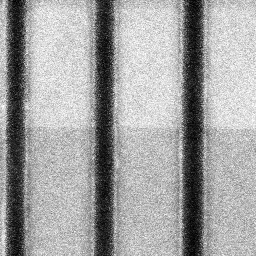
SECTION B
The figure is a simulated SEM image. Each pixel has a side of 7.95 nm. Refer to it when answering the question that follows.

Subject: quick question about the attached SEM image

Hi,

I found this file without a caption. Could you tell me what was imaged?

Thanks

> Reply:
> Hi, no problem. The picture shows one or a few lines or trenches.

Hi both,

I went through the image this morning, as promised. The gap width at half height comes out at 0.514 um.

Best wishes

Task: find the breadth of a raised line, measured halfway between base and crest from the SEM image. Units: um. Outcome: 0.19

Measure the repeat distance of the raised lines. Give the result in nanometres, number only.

704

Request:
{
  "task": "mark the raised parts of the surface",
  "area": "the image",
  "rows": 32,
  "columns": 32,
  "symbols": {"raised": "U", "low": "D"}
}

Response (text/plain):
DUUUDDDDDDDDUUUDDDDDDDDUUUDDDDDD
DUUUDDDDDDDDUUUDDDDDDDDUUUDDDDDD
DUUUDDDDDDDDUUUDDDDDDDDUUUDDDDDD
DUUUDDDDDDDDUUUDDDDDDDDUUUDDDDDD
DUUUDDDDDDDDUUUDDDDDDDDUUUDDDDDD
DUUDDDDDDDDDUUUDDDDDDDDUUUDDDDDD
DUUDDDDDDDDDUUUDDDDDDDDUUUDDDDDD
DUUDDDDDDDDDUUUDDDDDDDDUUUDDDDDD
DUUDDDDDDDDDUUUDDDDDDDDUUUDDDDDD
DUUDDDDDDDDDUUDDDDDDDDDUUUDDDDDD
DUUDDDDDDDDDUUDDDDDDDDDUUUDDDDDD
DUUDDDDDDDDDUUUDDDDDDDDUUUDDDDDD
DUUDDDDDDDDDUUUDDDDDDDDUUUDDDDDD
UUUDDDDDDDDDUUDDDDDDDDDUUUDDDDDD
DUUDDDDDDDDUUUDDDDDDDDDUUUDDDDDD
DUUDDDDDDDDDUUDDDDDDDDDUUUDDDDDD
DUUDDDDDDDDDUUDDDDDDDDDUUUDDDDDD
DUUDDDDDDDDDUUDDDDDDDDDUUUDDDDDD
DUUDDDDDDDDDUUUDDDDDDDDUUUDDDDDD
DUUDDDDDDDDDUUUDDDDDDDDUUUDDDDDD
DUUDDDDDDDDDUUUDDDDDDDDUUUDDDDDD
DUUDDDDDDDDDUUUDDDDDDDDUUUDDDDDD
DUUDDDDDDDDDUUUDDDDDDDDUUUDDDDDD
DUUDDDDDDDDDUUDDDDDDDDDUUUDDDDDD
DUUDDDDDDDDDUUDDDDDDDDDUUUDDDDDD
DUUDDDDDDDDDUUDDDDDDDDDUUUDDDDDD
DUUDDDDDDDDDUUUDDDDDDDDUUUDDDDDD
DUUDDDDDDDDDUUUDDDDDDDDUUUDDDDDD
DUUDDDDDDDDDUUDDDDDDDDDUUUDDDDDD
DUUDDDDDDDDDUUDDDDDDDDDUUUDDDDDD
DUUDDDDDDDDDUUDDDDDDDDDUUUDDDDDD
DUUDDDDDDDDDUUDDDDDDDDDUUUDDDDDD